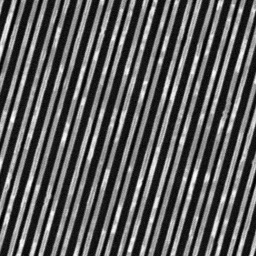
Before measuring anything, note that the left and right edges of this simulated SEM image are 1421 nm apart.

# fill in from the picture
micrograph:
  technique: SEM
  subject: parallel lines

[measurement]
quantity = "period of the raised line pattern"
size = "58.7 nm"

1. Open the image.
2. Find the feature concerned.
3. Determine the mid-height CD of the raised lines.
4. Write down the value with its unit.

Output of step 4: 0.0241 microns